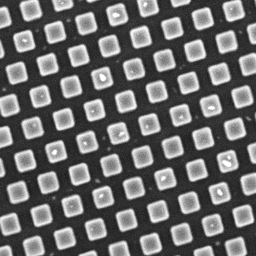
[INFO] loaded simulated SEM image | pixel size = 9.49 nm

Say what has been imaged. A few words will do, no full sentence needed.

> a regular array of raised bodies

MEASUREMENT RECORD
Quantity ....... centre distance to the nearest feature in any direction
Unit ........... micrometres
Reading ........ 0.305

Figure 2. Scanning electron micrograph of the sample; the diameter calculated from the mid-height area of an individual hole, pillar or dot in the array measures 196 nm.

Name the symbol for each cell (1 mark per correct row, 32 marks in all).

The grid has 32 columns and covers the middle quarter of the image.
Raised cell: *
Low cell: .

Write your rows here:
...............*****...*****....
........***....*****....*.......
.......*****....****...........*
.**....*****....**...........***
****...*****...........**....***
****....***..........****....***
****.................****....***
****..........***....*****......
.............****....*****......
.......**....*****....*.........
.....*****...*****...........**.
**...*****....***..........****.
**....****.................****.
**....***..........****....*****
**.................*****...****.
**..........***....*****........
...........*****...*****........
.....***...*****....*...........
...*****....****...........**...
...*****....**...........****...
....****.................****...
....****..........***....*****..
*................*****...****...
..........****...*****....*.....
.........*****....****..........
...***...*****....***..........*
.*****....****...........**....*
..****....***..........****....*
..****...........**....*****...*
..***..........****....*****....
...............*****...****.....
........****...*****............